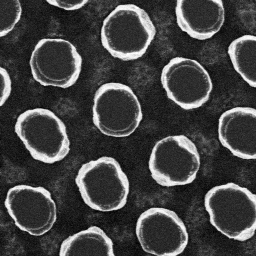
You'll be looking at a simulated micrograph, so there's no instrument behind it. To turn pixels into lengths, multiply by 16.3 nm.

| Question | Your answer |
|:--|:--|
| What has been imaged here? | a regular array of raised bodies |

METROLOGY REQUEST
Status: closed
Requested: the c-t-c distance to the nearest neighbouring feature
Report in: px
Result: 75.2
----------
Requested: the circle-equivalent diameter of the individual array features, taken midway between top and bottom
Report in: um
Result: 0.784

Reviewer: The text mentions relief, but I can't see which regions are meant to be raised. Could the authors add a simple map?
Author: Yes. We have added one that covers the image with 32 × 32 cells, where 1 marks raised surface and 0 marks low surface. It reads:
11000001110000000000001111110000
11100000000000111000001111110000
11000000000001111100000111110000
10000000000001111110000111100000
00000000000001111110000001000000
00000111100001111100000000000111
00001111100000111100000000000111
00001111110000000000001100000111
00001111110000000000011110000111
10001111100000000000111111000011
10000011000000000000011111000000
10000000000001110000011111000000
00000000000011111000001111000000
00000000000011111100000000000000
00011110000011111000000000001111
00111110000011111000000000001111
00111111000001111000000000011111
00011111000000000000111000001111
00011111000000000001111100000111
00000110000000000001111110000011
00000000000111000001111110000000
00000000001111100001111110000000
00000000001111110000111100000000
00110000001111110000000000011100
01111100001111110000000000111110
01111110000111100000000000111111
01111110000000000001100000111111
00111110000000000011110000111111
00011100000000000111111000011111
00000000011110000111111000001100
00000000111111000011111000000000
00000000111111000011111000000000